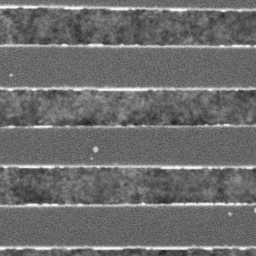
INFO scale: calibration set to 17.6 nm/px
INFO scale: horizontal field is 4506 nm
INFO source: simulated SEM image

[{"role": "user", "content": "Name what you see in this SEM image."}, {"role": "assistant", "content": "lines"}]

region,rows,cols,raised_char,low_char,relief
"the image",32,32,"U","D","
UUUUUUUUUUUUUUUUUUUUUUUUUUUUUUUU
DDDDDDDDDDDDDDDDDDDDDDDDDDDDDDDD
DDDDDDDDDDDDDDDDDDDDDDDDDDDDDDDD
DDDDDDDDDDDDDDDDDDDDDDDDDDDDDDDD
DDDDDDDDDDDDDDDDDDDDDDDDDDDDDDDD
DDDDDDDDDDDDDDDDDDDDDDDDDDDDDDDD
UUUUUUUUUUUUUUUUUUUUUUUUUUUUUUUU
UUUUUUUUUUUUUUUUUUUUUUUUUUUUUUUU
UUUUUUUUUUUUUUUUUUUUUUUUUUUUUUUU
UUUUUUUUUUUUUUUUUUUUUUUUUUUUUUUU
UUUUUUUUUUUUUUUUUUUUUUUUUUUUUUUU
DDDDDDDDDDDDDDDDDDDDDDDDDDDDDDDD
DDDDDDDDDDDDDDDDDDDDDDDDDDDDDDDD
DDDDDDDDDDDDDDDDDDDDDDDDDDDDDDDD
DDDDDDDDDDDDDDDDDDDDDDDDDDDDDDDD
DDDDDDDDDDDDDDDDDDDDDDDDDDDDDDDD
UUUUUUUUUUUUUUUUUUUUUUUUUUUUUUUU
UUUUUUUUUUUUUUUUUUUUUUUUUUUUUUUU
UUUUUUUUUUUUUUUUUUUUUUUUUUUUUUUU
UUUUUUUUUUUUUUUUUUUUUUUUUUUUUUUU
UUUUUUUUUUUUUUUUUUUUUUUUUUUUUUUU
DDDDDDDDDDDDDDDDDDDDDDDDDDDDDDDD
DDDDDDDDDDDDDDDDDDDDDDDDDDDDDDDD
DDDDDDDDDDDDDDDDDDDDDDDDDDDDDDDD
DDDDDDDDDDDDDDDDDDDDDDDDDDDDDDDD
DDDDDDDDDDDDDDDDDDDDDDDDDDDDDDDU
UUUUUUUUUUUUUUUUUUUUUUUUUUUUUUUU
UUUUUUUUUUUUUUUUUUUUUUUUUUUUUUUU
UUUUUUUUUUUUUUUUUUUUUUUUUUUUUUUU
UUUUUUUUUUUUUUUUUUUUUUUUUUUUUUUU
UUUUUUUUUUUUUUUUUUUUUUUUUUUUUUUU
DDDDDDDDDDDDDDDDDDDDDDDDDDDDDDDD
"